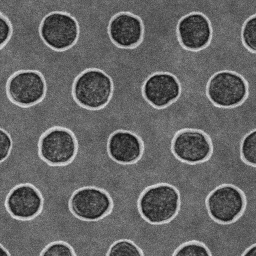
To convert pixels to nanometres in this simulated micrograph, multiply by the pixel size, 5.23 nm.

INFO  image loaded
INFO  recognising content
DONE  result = a regular array of holes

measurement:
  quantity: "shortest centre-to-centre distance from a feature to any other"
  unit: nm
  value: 344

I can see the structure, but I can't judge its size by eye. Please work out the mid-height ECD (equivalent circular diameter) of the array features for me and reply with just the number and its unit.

184 nm